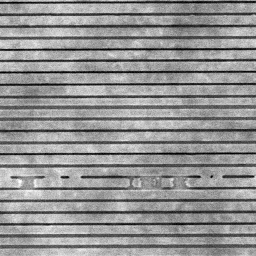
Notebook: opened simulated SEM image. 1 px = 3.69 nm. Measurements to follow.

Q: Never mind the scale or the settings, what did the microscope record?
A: parallel lines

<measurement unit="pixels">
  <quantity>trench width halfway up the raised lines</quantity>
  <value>2.76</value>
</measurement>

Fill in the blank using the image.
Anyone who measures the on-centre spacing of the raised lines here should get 43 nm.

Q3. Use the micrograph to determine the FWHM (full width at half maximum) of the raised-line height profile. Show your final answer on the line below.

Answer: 33.7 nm